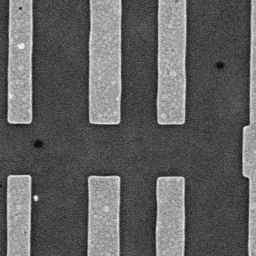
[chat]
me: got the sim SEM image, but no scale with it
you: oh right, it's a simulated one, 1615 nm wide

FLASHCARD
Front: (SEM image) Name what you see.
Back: groups of lines, slits or small figures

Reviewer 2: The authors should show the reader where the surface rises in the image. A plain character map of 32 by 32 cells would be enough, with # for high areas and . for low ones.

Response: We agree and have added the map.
.###.......####.....###.........
.###.......####.....###.........
.###.......####.....###.........
.###.......####.....###.........
.###.......####.....###.........
.###.......####.....###.........
.###.......####.....###........#
.###.......####.....###........#
.###.......####.....###........#
.###.......####.....###........#
.###.......####.....###........#
.###.......####.....###........#
.###.......####.....###........#
.###.......####.....###........#
.###.......####.....###........#
...............................#
..............................##
..............................##
..............................##
..............................##
..............................##
..............................##
.###.......####.....###........#
.###.......####.....###........#
.###.......####.....###........#
.###.......####.....###........#
.###.......####.....###........#
.###.......####.....###........#
.###.......####.....###........#
.###.......####.....###........#
.###.......####.....###........#
.###.......####.....###........#